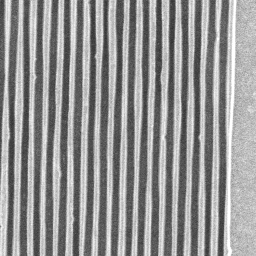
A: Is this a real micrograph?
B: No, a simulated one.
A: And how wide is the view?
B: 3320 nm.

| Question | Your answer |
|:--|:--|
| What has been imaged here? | parallel lines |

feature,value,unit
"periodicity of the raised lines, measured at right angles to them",171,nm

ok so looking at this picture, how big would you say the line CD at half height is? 0.0616 micrometres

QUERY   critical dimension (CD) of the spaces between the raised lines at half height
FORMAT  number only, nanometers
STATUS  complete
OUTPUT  110